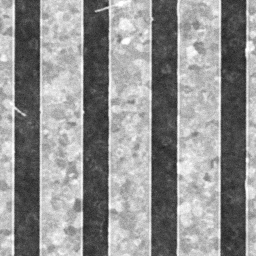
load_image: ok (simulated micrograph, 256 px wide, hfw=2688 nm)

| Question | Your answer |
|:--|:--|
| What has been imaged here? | one or a few lines or trenches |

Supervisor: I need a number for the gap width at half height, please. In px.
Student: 27.1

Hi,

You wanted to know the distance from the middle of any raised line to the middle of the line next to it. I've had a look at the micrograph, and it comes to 723 nm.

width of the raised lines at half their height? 435 nanometres